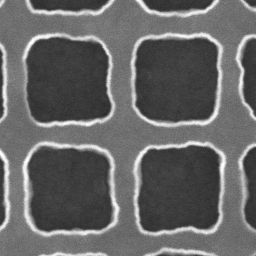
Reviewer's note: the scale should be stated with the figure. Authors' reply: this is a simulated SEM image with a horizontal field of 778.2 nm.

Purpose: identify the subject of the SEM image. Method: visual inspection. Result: holes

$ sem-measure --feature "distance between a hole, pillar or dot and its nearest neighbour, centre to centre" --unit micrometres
0.331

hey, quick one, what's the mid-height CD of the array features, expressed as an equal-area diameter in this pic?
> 276 nm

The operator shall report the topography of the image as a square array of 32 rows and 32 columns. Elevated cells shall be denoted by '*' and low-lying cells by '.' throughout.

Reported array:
****.........*****........*****.
*********.**********.*.*********
********************************
********************************
********************************
****.........*****.........****.
****.........****..........***..
***...........***..........***..
***..........****..........***..
***..........****..........***..
***..........****..........***..
***..........****..........***..
***...........***..........****.
****..........***..........****.
****.........*****........******
********************************
********************************
********************************
*****....************.*...******
****.........*****.........****.
***...........***...........**..
.**...........***...........***.
****..........****..........***.
.***..........***...........***.
.***..........***..........****.
.***..........***..........****.
.***..........***..........***..
.***..........***..........****.
*****........*****....**..******
********************************
********************************
********************************